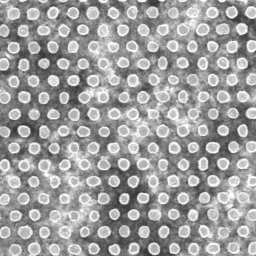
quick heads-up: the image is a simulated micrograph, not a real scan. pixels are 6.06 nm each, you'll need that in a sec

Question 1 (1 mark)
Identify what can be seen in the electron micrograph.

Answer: a regular array of raised bodies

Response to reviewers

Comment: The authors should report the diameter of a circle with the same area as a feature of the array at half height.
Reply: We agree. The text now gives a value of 65.2 nm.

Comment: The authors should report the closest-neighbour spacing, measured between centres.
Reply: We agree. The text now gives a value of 114 nanometers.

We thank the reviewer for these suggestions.